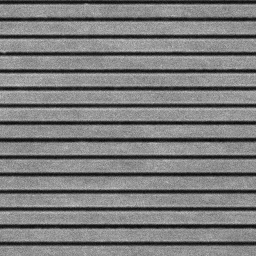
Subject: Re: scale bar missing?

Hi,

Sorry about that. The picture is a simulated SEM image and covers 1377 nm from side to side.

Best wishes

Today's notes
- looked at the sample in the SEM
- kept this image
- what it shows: parallel lines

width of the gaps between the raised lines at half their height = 26.2 nm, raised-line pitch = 92.9 nanometers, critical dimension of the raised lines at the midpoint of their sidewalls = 12.5 pixels